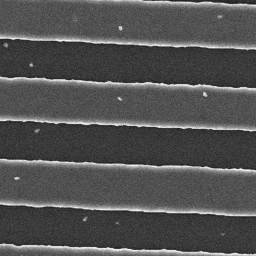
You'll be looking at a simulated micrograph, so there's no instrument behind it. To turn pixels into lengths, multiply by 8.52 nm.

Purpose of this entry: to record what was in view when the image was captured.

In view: lines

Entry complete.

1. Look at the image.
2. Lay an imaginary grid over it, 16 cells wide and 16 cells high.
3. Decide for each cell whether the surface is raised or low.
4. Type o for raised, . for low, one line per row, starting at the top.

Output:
oooooooooooooooo
oooooooooooooooo
..oooooooooooooo
................
................
oooooooooooooooo
oooooooooooooooo
oooooooooooooooo
................
................
ooooooooooooo...
oooooooooooooooo
oooooooooooooooo
................
................
ooooooo.........